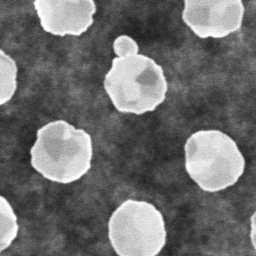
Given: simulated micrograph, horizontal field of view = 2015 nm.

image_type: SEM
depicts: raised bodies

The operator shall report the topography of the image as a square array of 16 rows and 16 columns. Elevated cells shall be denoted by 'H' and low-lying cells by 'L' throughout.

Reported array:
LLHHHHLLLLLLHHHL
LLLHHHLLLLLLHHHL
LLLLLLLHLLLLLLLL
HLLLLLLHHLLLLLLL
HLLLLLLHHHLLLLLL
HLLLLLLHHHLLLLLL
LLLLLLLHHHLLLLLL
LLLLLLLLLLLLLLLL
LLHHHLLLLLLLHHLL
LLHHHHLLLLLLHHHL
LLHHHLLLLLLLHHHL
LLLLLLLLLLLLHHHL
LLLLLLLLLLLLLLLL
HLLLLLLHHHLLLLLL
HLLLLLLHHHLLLLLL
LLLLLLLHHHLLLLLL